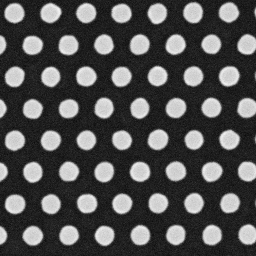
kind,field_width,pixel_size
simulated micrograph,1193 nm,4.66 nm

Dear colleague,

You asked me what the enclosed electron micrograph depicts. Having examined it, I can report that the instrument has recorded a regular array of raised bodies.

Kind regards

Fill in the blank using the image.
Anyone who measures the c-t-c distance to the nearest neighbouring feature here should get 0.166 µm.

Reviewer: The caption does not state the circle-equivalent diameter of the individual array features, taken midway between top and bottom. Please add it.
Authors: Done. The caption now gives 0.0873 micrometres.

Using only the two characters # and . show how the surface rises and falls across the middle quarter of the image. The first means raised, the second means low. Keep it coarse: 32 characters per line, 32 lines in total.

................................
....###......###......###......#
...#####....#####....#####....##
...#####....#####....#####....##
....####....####.....####.....##
.............##.................
................................
................................
................................
###.....####.....###......####..
###.....####.....####.....####..
###.....####.....####.....####..
###.....####.....####.....####..
..................#.............
................................
................................
................................
....###......###......####.....#
...#####....#####....#####....##
...#####....#####....#####....##
....###......###......###......#
................................
................................
................................
................................
###.....####.....####.....####..
###.....####.....####.....####..
###.....####.....####.....####..
###.....####.....####.....####..
................................
................................
................................